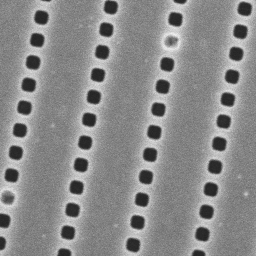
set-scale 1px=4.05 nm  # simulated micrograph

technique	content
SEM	a regular array of holes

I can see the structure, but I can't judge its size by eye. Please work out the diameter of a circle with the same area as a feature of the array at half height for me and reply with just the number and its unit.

59.7 nanometers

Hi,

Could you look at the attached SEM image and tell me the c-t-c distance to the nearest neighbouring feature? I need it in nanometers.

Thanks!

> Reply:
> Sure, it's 92.3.